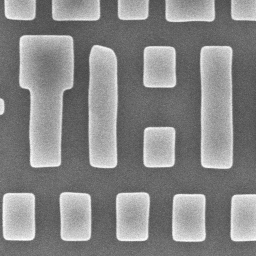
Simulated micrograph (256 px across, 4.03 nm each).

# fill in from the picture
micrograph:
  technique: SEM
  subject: wiring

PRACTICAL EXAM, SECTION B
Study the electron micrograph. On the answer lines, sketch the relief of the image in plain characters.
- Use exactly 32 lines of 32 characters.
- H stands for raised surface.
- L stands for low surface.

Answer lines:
LHHHLLLHHHHHLLLHHHHLLHHHHHHLLHHH
LHHHLLLHHHHHLLLHHHLLLHHHHHHLLHHH
LLLLLLLHLLLLLLLLLLLLLHHHHHHLLLLH
LLLLLLLLLLLLLLLLLLLLLLLLLLLLLLLL
LLLHHHHHHLLLLLLLLLLLLLLLLLLLLLLL
LLLHHHHHHLLLLLLLLLLLLLLLLLLLLLLL
LLLHHHHHHLLHHHLLLLHHHHLLLHHHHLLL
LLLHHHHHHLLHHHHLLLHHHHLLLHHHHLLL
LLLHHHHHHLLHHHHLLLHHHHLLLHHHHLLL
LLHHHHHHHLLHHHHLLLHHHHLLLHHHHLLL
LLHHHHHHHLLHHHHLLLHHHHLLLHHHHLLL
LLLLHHHHLLLHHHHLLLLLLLLLLHHHHLLL
LLLLHHHHLLLHHHHLLLLLLLLLLHHHHLLL
LLLLHHHHLLLHHHHLLLLLLLLLLHHHHLLL
LLLLHHHHLLLHHHHLLLLLLLLLLHHHHLLL
LLLLHHHHLLLHHHHLLLLLLLLLLHHHHLLL
LLLLHHHHLLLHHHHLLLHHHHLLLHHHHLLL
LLLLHHHHLLLHHHHLLLHHHHLLLHHHHLLL
LLLLHHHHLLLHHHHLLLHHHHLLLHHHHLLL
LLLLHHHHLLLHHHHLLLHHHHLLLHHHHLLL
LLLLHHHLLLLHHHHLLLHHHHLLLHHHHLLL
LLLLLLLLLLLLLLLLLLLLLLLLLLLLLLLL
LLLLLLLLLLLLLLLLLLLLLLLLLLLLLLLL
LLLLLLLLLLLLLLLLLLLLLLLLLLLLLLLL
LHHHLLLLHHHLLLLHHHHLLLHHHLLLLHHH
HHHHLLLLHHHLLLLHHHHLLLHHHHLLLHHH
HHHHLLLLHHHLLLLHHHHLLLHHHHLLLHHH
HHHHLLLLHHHLLLLHHHHLLLHHHHLLLHHH
HHHHLLLLHHHLLLLHHHLLLLHHHHLLLHHH
HHHHLLLLHHHLLLLHHHLLLLHHHHLLLHHH
LLLLLLLLLLLLLLLLLLLLLLLLLLLLLLLL
LLLLLLLLLLLLLLLLLLLLLLLLLLLLLLLL